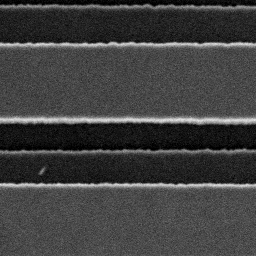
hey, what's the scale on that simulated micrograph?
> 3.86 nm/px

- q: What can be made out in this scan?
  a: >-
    lines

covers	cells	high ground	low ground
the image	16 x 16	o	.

................
................
................
oooooooooooooooo
oooooooooooooooo
oooooooooooooooo
oooooooooooooooo
oooooooooooooooo
................
................
................
oo....oo.o......
oooooooooooooooo
oooooooooooooooo
oooooooooooooooo
oooooooooooooooo